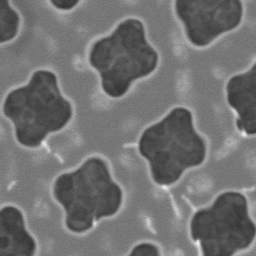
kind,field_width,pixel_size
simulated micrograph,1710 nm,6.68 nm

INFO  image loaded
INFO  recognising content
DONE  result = holes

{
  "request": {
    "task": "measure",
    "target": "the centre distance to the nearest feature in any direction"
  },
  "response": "657 nm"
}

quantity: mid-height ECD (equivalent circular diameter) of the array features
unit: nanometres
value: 436